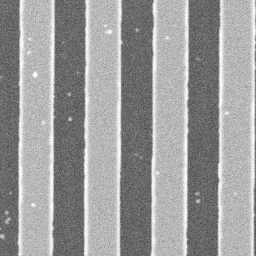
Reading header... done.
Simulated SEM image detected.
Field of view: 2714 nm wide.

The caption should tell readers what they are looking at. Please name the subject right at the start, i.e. lines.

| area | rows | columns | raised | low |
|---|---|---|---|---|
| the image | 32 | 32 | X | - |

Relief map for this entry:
---XXXX----XXXX----XXXX-----XXXX
---XXXX----XXXX----XXXX-----XXXX
---XXXX----XXXX----XXXX-----XXXX
---XXXX----XXXX----XXXX-----XXXX
---XXXX----XXXX----XXXX-----XXXX
---XXXX----XXXX----XXXX-----XXXX
---XXXX----XXXX----XXXX-----XXXX
---XXXX----XXXX----XXXX-----XXXX
---XXXX----XXXX----XXXX-----XXXX
---XXXX----XXXX----XXXX-----XXXX
---XXXX----XXXX----XXXX-----XXXX
---XXXX----XXXX----XXXX-----XXXX
---XXXX----XXXX----XXXX-----XXXX
---XXXX----XXXX----XXXX-----XXXX
---XXXX----XXXX----XXXX-----XXXX
--XXXXX----XXXX----XXXX-----XXXX
---XXXX----XXXX----XXXX-----XXXX
--XXXXX----XXXX----XXXX-----XXXX
--XXXXX----XXXX----XXXX-----XXXX
--XXXXX----XXXX----XXXX-----XXXX
--XXXXX----XXXX----XXXX----XXXXX
--XXXXX----XXXX----XXXX----XXXXX
--XXXXX----XXXX----XXXX----XXXXX
--XXXXX----XXXX----XXXX----XXXXX
--XXXXX----XXXX----XXXX----XXXXX
--XXXXX----XXXX----XXXX----XXXXX
--XXXXX----XXXX----XXXX----XXXXX
--XXXXX----XXXX----XXXX----XXXXX
--XXXX-----XXXX----XXXX----XXXXX
--XXXX-----XXXX----XXXX----XXXXX
--XXXXX----XXXX----XXXX----XXXXX
--XXXX-----XXXX----XXXX----XXXXX